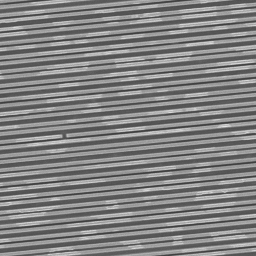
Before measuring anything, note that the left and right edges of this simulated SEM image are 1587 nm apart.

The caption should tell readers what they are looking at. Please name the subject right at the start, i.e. parallel lines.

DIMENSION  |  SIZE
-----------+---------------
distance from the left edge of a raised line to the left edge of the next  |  43.4 nm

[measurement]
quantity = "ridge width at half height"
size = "25.4 nanometres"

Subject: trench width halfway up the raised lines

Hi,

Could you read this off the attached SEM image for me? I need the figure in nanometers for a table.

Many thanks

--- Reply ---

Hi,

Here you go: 26.2